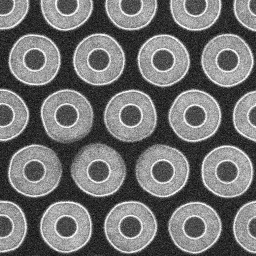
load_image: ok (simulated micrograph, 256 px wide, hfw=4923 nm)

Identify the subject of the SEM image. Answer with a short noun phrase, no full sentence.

an array of small figures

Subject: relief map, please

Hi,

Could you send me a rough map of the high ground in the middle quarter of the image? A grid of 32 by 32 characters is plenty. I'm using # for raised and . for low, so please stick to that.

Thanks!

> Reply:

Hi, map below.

###...#####....####...#####....#
###....###....#####....###.....#
####..........######..........##
#####........########........###
######.....###########......####
################################
################################
....##########......##########..
.....#######.........########...
......######..........######....
##....#####....###....#####.....
###....####...#####...#####...##
###....###....######...####...##
###....###....######...###....##
###....####...#####....####...##
##.....####....###....#####.....
......#####...........######....
.....#######.........#######....
...###########.....###########..
################################
#######...######################
#####.......#########.......####
####.........#######.........###
###...........#####...........##
###....###....#####....###.....#
##....#####....###....#####....#
##....#####....###....######...#
##....#####....###....######...#
###...#####....####...#####....#
###.....##....#####....###....##
####..........######.........###
#####........########........###